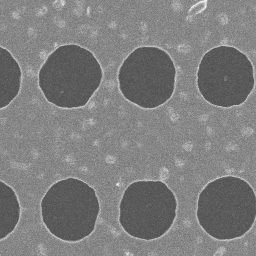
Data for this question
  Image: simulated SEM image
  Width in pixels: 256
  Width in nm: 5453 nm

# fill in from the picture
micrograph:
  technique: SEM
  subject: holes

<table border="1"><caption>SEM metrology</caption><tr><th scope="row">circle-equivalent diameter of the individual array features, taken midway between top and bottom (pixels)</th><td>59.2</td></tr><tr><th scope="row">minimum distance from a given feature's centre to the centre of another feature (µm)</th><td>1.65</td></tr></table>